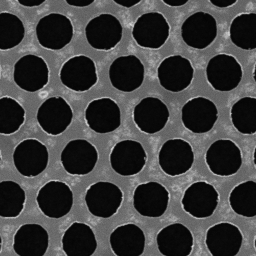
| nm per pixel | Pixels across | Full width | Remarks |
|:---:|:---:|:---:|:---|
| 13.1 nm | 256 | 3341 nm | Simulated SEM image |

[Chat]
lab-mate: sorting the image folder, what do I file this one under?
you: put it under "a regular array of holes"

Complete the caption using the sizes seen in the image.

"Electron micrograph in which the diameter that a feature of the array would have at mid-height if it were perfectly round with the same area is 471 nm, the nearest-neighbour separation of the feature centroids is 624 nm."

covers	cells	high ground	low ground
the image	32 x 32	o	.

ooo..oooo..oooo..oooo..oooo..ooo
oooooooooooooooooooooooooooooooo
...oo....oo....oo....oo....oo...
...oo....oo....oo....oo....oo...
...oo....oo....oo....oo....oo...
..ooo...ooo....oo...ooo...ooo...
oooooooooooooooooooooooooooooooo
oo...oooo..ooo...oooo..ooo...ooo
oo....oo....oo....oo....oo....oo
oo....oo....oo....oo....oo....oo
oo....oo....oo....oo....oo....oo
oooooooooooooooooooooooooooooooo
..oooo..oooo..oooo..oooo..oooo..
...oo....oo....oo....oo....oo...
...oo....oo....oo....oo....oo...
...oo....oo....oo....oo....oo...
..oooo..oooo.ooooo..oooo..oooo..
ooo..oooooooooooooooo..ooooooooo
oo....oo....oo....oo....oo....oo
oo....oo....oo....oo....oo....oo
oo....oo....oo....oo....oo....oo
oo...ooo...oooo..oooo..oooo..ooo
oooooooooooooooooooooooooooooooo
...oo....oo....oo....oo....oo...
...oo....oo....oo....oo....oo...
...oo....oo....oo....oo....oo...
...oo...ooo...ooo....oo....oo...
oooooooooooooooooooooooooooooooo
ooo..oooo..oooo...oo...ooo....oo
oo....oo....oo....oo....oo....oo
oo....oo....oo....oo....oo....oo
oo....oo....oo....oo....oo....oo